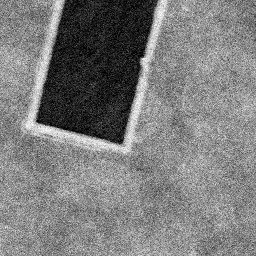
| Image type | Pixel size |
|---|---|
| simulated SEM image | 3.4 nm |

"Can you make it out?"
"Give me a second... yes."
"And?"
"one or a few lines or trenches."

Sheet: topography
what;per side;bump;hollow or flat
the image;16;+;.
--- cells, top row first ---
++++......++++++
+++.......++++++
+++.......++++++
+++......+++++++
+++......+++++++
++.......+++++++
++.......+++++++
++......++++++++
++++....++++++++
++++++++++++++++
++++++++++++++++
++++++++++++++++
++++++++++++++++
++++++++++++++++
++++++++++++++++
++++++++++++++++